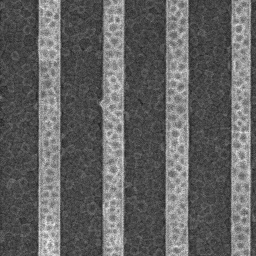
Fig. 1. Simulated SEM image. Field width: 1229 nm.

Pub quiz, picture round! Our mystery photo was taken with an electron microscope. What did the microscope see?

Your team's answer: one or a few lines or trenches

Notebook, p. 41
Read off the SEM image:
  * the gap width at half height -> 214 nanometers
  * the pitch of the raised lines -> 306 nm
